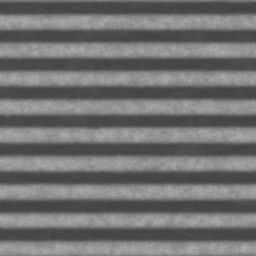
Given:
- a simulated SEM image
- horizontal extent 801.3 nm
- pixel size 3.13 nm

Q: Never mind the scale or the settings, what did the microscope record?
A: parallel lines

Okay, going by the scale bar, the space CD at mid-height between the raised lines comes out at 44.6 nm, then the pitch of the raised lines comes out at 88.7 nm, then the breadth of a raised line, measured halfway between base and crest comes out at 45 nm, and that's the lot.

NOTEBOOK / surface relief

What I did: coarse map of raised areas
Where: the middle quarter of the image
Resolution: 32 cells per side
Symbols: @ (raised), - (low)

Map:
--------------------------------
--------------------------------
@@@@@@@@@@@@@@@@@@@@@@@@@@@@@@@@
@@@@@@@@@@@@@@@@@@@@@@@@@@@@@@@@
@@@@@@@@@@@@@@@@@@@@@@@@@@@@@@@@
--------------------------------
--------------------------------
--------------------------------
--------------------------------
@@@@@@@@@@@@@@@@@@@@@@@@@@@@@@@@
@@@@@@@@@@@@@@@@@@@@@@@@@@@@@@@@
@@@@@@@@@@@@@@@@@@@@@@@@@@@@@@@@
--------------------------------
--------------------------------
--------------------------------
--------------------------------
@@@@@@@@@@@@@@@@@@@@@@@@@@@@@@@@
@@@@@@@@@@@@@@@@@@@@@@@@@@@@@@@@
@@@@@@@@@@@@@@@@@@@@@@@@@@@@@@@@
@@@@@@@@@@@@@@@@@@@@@@@@@@@@@@@@
--------------------------------
--------------------------------
--------------------------------
@@@@@@@@@@@@@@@@@@@@@@@@@@@@@@@@
@@@@@@@@@@@@@@@@@@@@@@@@@@@@@@@@
@@@@@@@@@@@@@@@@@@@@@@@@@@@@@@@@
@@@@@@@@@@@@@@@-@@@@@@@@@@@@@@@@
--------------------------------
--------------------------------
--------------------------------
@@@@@@@@@@@@@@@@@@@@@@@@@@@@@@@@
@@@@@@@@@@@@@@@@@@@@@@@@@@@@@@@@